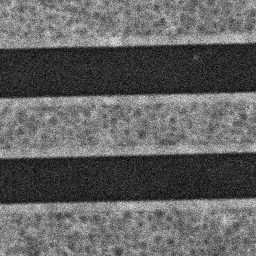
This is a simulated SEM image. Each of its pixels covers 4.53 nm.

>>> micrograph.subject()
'one or a few lines or trenches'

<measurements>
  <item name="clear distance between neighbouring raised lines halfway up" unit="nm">255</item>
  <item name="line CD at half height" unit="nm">237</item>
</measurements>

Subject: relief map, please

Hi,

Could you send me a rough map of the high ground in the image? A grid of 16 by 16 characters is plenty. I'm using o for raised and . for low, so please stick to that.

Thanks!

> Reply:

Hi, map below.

oooooooooooooooo
oooooooooooooooo
ooooooooooo.....
................
................
................
oooooooooooooooo
oooooooooooooooo
oooooooooooooooo
ooooo...........
................
................
................
oooooooooooooooo
oooooooooooooooo
oooooooooooooooo